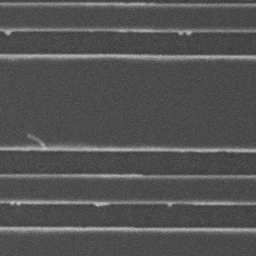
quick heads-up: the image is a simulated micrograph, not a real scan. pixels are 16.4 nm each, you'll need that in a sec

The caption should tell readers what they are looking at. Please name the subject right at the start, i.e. lines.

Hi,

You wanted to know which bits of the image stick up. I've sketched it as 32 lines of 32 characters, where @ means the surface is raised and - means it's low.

@@@@@@@@@@@@@@@@@@--------------
@@@@@@@@@@@@@@@@@@@@@@@@@@@@@@@@
@@@@@@@@@@@@@@@@@@@@@@@@@@@@@@@@
@@@@@@@@@@@@@@@@@@@@@@@@@@@@@@@@
--------------------------------
--------------------------------
--------------------------------
@@@@@@@@@@@@@@@@@@@@@@@@@@@@@@@@
@@@@@@@@@@@@@@@@@@@@@@@@@@@@@@@@
@@@@@@@@@@@@@@@@@@@@@@@@@@@@@@@@
@@@@@@@@@@@@@@@@@@@@@@@@@@@@@@@@
@@@@@@@@@@@@@@@@@@@@@@@@@@@@@@@@
@@@@@@@@@@@@@@@@@@@@@@@@@@@@@@@@
@@@@@@@@@@@@@@@@@@@@@@@@@@@@@@@@
@@@@@@@@@@@@@@@@@@@@@@@@@@@@@@@@
@@@@@@@@@@@@@@@@@@@@@@@@@@@@@@@@
@@@@@@@@@@@@@@@@@@@@@@@@@@@@@@@@
@@@@@@@@@@@@@@@@@@@@@@@@@@@@@@@@
@@@@@@@@@@@@@@@@@@@@@@@@@@@@@@@@
--------------------------------
--------------------------------
--------------------------------
@@@@@@@@@@@@@@@@@@@@@@@@@@@@@@@@
@@@@@@@@@@@@@@@@@@@@@@@@@@@@@@@@
@@@@@@@@@@@@@@@@@@@@@@@@@@@@@@@@
------------@--------@---@@@@@@@
--------------------------------
--------------------------------
--------------------------------
@@@@@@@@@@@@@@@@@@@@@@@@@@@@@@@@
@@@@@@@@@@@@@@@@@@@@@@@@@@@@@@@@
@@@@@@@@@@@@@@@@@@@@@@@@@@@@@@@@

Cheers